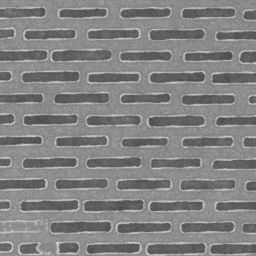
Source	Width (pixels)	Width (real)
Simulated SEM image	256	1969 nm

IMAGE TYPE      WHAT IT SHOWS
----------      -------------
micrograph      a regular array of holes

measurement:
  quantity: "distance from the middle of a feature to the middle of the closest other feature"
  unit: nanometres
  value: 289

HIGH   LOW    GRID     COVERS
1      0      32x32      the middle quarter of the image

11111111111111111111111111111111
11111111111111111111111111111111
00001110000000000001110000000000
00001100000000000001100000000000
00011100000000000011110000001110
11111111111111111111111111111111
11111111111111111111111111111111
00000000000111100001000000111111
00000000000111000000000000011100
00000000000111000000000000111100
11111111111111111111111111111111
11111111111111111111111111111111
11011111111111111111111111111111
00001100000000000001100000000000
00011000000000000001100000000000
11111111000010011111100000000000
11111111111111111111111111111111
11111111111111111111111111111111
00000000000111110000000000111100
00000000000111000000000000111000
00000000001111000000000001111100
11111111111111111111111111111111
11111111111111111111111111111111
00111111000000000001111111110001
00001100000000000001110000000000
00011100000000000001110000000000
11111111111111111111111111111111
11111111111111111111111111111111
11111111111111111111111111111111
00000000000110000000000000011000
00000000000110000000000000011000
11111111111111001111001011111000